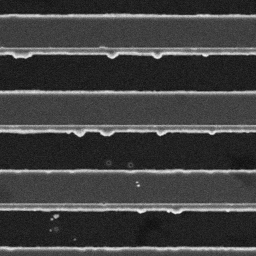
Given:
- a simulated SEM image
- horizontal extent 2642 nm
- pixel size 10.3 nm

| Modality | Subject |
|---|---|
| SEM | lines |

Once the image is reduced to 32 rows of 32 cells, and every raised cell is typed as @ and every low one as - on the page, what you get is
--------------------------------
--------------------------------
@@@@@@@@@@@@@@@@@@@@@@@@@@@@@@@@
@@@@@@@@@@@@@@@@@@@@@@@@@@@@@@@@
@@@@@@@@@@@@@@@@@@@@@@@@@@@@@@@@
@@@@@@@@@@@@@@@@@@@@@@@@@@@@@@@@
@@@@@@@@@@@@@@@@@@@@@@@@@@@@@@@@
--------------------------------
--------------------------------
--------------------------------
--------------------------------
--------------------------------
@@@@@@@@@@@@@@@@@@@@@@@@@@@@@@@@
@@@@@@@@@@@@@@@@@@@@@@@@@@@@@@@@
@@@@@@@@@@@@@@@@@@@@@@@@@@@@@@@@
@@@@@@@@@@@@@@@@@@@@@@@@@@@@@@@@
--------@@@-@@-----@@-----@-----
--------------------------------
--------------------------------
--------------------------------
--------------------------------
@@@@@@@@@@@@@@@@@@@@@@@@@@@@@@@@
@@@@@@@@@@@@@@@@@@@@@@@@@@@@@@@@
@@@@@@@@@@@@@@@@@@@@@@@@@@@@@@@@
@@@@@@@@@@@@@@@@@@@@@@@@@@@@@@@@
@@@@@@@@@@@@@@@@@@@@@@@@@@@@@@@@
-----------------@---@@---------
--------------------------------
--------------------------------
--------------------------------
--------------------------------
@@@@@@@@@@@@@@@@@@@@@@@@@@@@@@@@